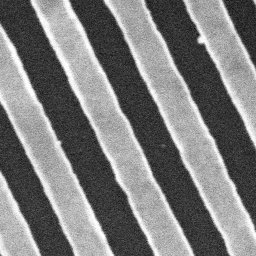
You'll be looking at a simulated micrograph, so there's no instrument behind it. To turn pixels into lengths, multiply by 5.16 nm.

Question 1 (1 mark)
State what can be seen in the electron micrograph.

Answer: lines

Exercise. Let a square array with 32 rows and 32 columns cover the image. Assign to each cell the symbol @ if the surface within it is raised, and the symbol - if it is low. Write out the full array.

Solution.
----@@@@@----@@@@@-----@@@@@----
-----@@@@-----@@@@@-----@@@@----
-----@@@@@-----@@@@-----@@@@@---
------@@@@-----@@@@------@@@@---
@-----@@@@@-----@@@@-----@@@@@--
@-----@@@@@-----@@@@@-----@@@@--
@@-----@@@@@-----@@@@-----@@@@@-
@@-----@@@@@-----@@@@------@@@@-
@@@-----@@@@@----@@@@@-----@@@@@
@@@------@@@@-----@@@@@-----@@@@
@@@@-----@@@@@----@@@@@-----@@@@
@@@@-----@@@@@-----@@@@@-----@@@
@@@@@-----@@@@@----@@@@@-----@@@
-@@@@-----@@@@@-----@@@@@-----@@
-@@@@@-----@@@@-----@@@@@-----@@
--@@@@-----@@@@@-----@@@@------@
--@@@@@-----@@@@@----@@@@@-----@
---@@@@-----@@@@@-----@@@@@-----
---@@@@@-----@@@@@----@@@@@-----
----@@@@-----@@@@@-----@@@@@----
----@@@@@-----@@@@-----@@@@@----
-----@@@@-----@@@@@-----@@@@----
@----@@@@@-----@@@@-----@@@@@---
@-----@@@@-----@@@@@-----@@@@---
@-----@@@@@-----@@@@-----@@@@@--
@@----@@@@@-----@@@@@-----@@@@--
@@-----@@@@@-----@@@@-----@@@@@-
@@@----@@@@@-----@@@@@-----@@@@-
@@@@----@@@@------@@@@@----@@@@@
@@@@----@@@@@-----@@@@@-----@@@@
@@@@-----@@@@------@@@@-----@@@@
@@@@@----@@@@@-----@@@@@-----@@@